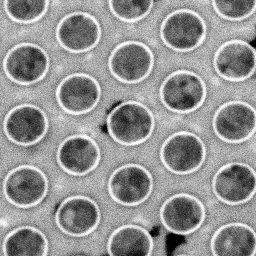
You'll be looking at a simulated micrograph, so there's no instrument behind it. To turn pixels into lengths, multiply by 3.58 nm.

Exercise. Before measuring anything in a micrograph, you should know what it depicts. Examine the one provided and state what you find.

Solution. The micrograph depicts a regular array of raised bodies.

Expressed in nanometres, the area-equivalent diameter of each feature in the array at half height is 150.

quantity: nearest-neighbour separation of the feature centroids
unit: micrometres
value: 0.215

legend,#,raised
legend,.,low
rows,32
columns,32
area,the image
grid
.#####........#####........#####
.#####........#####...##...#####
..###...####...##....####.......
.......#####........######......
.......#####........######......
...#....####...###...####...###.
.#####...#....#####........#####
.#####........#####........#####
.#####........#####........#####
.####....##...####...####...###.
........####........#####.......
.......#####........######......
.......#####........#####.......
..###...####..####...####...####
.#####........#####........#####
.#####.......######........#####
.#####........#####........#####
.####...###...####...####...###.
.......#####........######......
.......#####........######......
.......#####.........####....#..
.####...###...####....##...#####
.#####........#####........#####
.#####........#####........#####
.#####........####....##...####.
..##....####...##....####.......
.......#####........#####.......
.......#####........#####.......
...#....####...###...####...###.
.####.........#####........#####
######........#####.......######
.#####........#####........#####